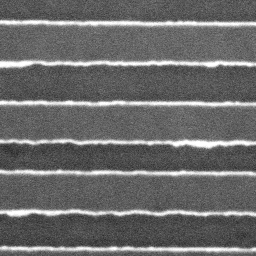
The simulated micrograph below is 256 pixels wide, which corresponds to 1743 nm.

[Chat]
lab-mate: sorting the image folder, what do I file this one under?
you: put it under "lines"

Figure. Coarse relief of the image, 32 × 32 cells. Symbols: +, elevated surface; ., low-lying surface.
................................
................................
................................
++++++++++++++++++++++++++++++++
++++++++++++++++++++++++++++++++
++++++++++++++++++++++++++++++++
++++++++++++++++++++++++++++++++
++++++++++++++++++++++++++++++++
................................
................................
................................
................................
................................
++++++++++++++++++++++++++++++++
++++++++++++++++++++++++++++++++
++++++++++++++++++++++++++++++++
++++++++++++++++++++++++++++++++
++++++++++++++++++++++++++++++++
................................
................................
................................
++++++++++.++++.+++.............
++++++++++++++++++++++++++++++++
++++++++++++++++++++++++++++++++
++++++++++++++++++++++++++++++++
++++++++++++++++++++++++++++++++
+++.++.++.++++++++++++++++++++++
................................
................................
................................
................................
++++++++++++++++++++++++++++++++